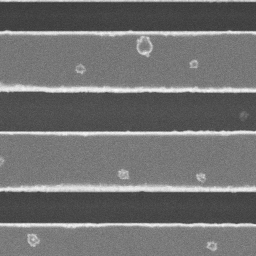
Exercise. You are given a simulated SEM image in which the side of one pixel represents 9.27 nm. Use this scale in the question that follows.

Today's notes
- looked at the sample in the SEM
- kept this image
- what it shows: lines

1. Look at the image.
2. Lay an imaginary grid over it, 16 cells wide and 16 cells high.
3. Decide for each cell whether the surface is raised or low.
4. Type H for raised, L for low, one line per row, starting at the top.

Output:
LLLLLLLLLLLLLLLL
LLLLLLLLLLLLLLLL
HHHHHHHHHHHHHHHH
HHHHHHHHHHHHHHHH
HHHHHHHHHHHHHHHH
HHHHHHHHHHHHHHHH
LLLLLLLLLLLLLLLL
LLLLLLLLLLLLLLLL
HHHHHHHHHHHHHHHH
HHHHHHHHHHHHHHHH
HHHHHHHHHHHHHHHH
HHHHHHHHHHHHHHHH
LLLLLLLLLLLLLLLL
LLLLLLLLLLLLLLLL
HHHHHHHHHHHHHHHH
HHHHHHHHHHHHHHHH